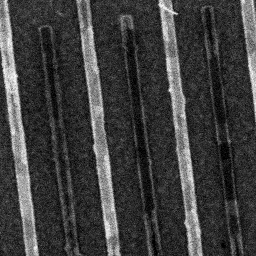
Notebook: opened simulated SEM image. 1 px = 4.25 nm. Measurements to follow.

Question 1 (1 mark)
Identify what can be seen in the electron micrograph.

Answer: parallel lines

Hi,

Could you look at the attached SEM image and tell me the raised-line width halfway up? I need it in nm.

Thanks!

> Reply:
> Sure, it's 48.9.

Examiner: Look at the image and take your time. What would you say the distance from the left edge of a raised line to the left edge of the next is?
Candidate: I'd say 40.7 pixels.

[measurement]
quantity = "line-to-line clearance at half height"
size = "124 nm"